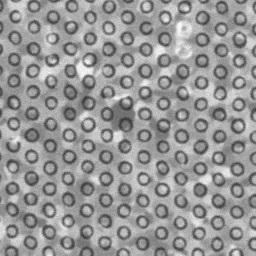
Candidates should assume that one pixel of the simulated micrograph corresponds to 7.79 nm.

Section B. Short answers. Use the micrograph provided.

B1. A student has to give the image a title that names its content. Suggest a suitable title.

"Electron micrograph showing a regular array of ring-shaped grooves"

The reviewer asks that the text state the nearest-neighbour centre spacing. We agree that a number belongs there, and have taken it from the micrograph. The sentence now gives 161 nm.